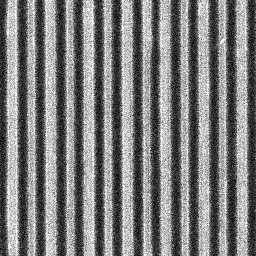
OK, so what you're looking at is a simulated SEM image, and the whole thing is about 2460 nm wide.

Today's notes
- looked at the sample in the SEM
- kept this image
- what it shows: parallel lines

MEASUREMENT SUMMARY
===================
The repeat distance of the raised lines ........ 182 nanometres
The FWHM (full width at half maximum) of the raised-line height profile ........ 126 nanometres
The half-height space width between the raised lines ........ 67.2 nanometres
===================